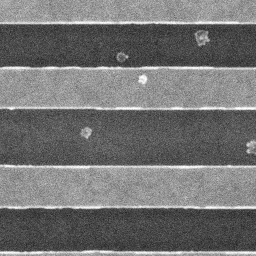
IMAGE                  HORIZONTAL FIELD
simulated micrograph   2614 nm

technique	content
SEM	lines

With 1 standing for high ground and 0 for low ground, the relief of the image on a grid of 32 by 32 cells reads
11111111111111111111111111111111
11111111111111111111111111111111
11111111111111111111111111111111
00000000000000000000000000000000
00000000000000000000000000000000
00000000000000000000000000000000
00000000000000000000000000000000
00000000000000000000000000000000
11110110110011100111111111100000
11111111111111111111111111111111
11111111111111111111111111111111
11111111111111111111111111111111
11111111111111111111111111111111
01000000000011111111111111111111
00000000000000000000000000000000
00000000000000000000000000000000
00000000000000000000000000000000
00000000000000000000000000000000
00000000000000000000000000000000
00000000000000000000000000000000
00000000000000000000000000000000
11111111111111111111111111111111
11111111111111111111111111111111
11111111111111111111111111111111
11111111111111111111111111111111
11111111111111111111111111111111
00000000000000000000000000000000
00000000000000000000000000000000
00000000000000000000000000000000
00000000000000000000000000000000
00000000000000000000000000000000
00000000001111000000000000000000